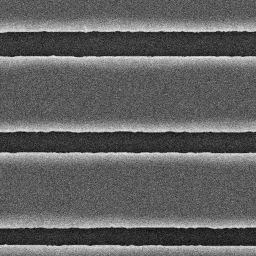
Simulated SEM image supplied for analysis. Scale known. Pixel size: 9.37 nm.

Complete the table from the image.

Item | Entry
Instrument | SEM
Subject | lines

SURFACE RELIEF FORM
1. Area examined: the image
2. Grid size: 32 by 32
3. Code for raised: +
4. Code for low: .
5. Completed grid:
++++++++++++++++++++++++++++++++
++++++++++++++++++++++++++++++++
++++++++++++++++++++++++++++++++
++++++++++++++++++++++++++++++++
................................
................................
................................
++++++++++++++++++++++++++++++++
++++++++++++++++++++++++++++++++
++++++++++++++++++++++++++++++++
++++++++++++++++++++++++++++++++
++++++++++++++++++++++++++++++++
++++++++++++++++++++++++++++++++
++++++++++++++++++++++++++++++++
++++++++++++++++++++++++++++++++
++++++++++++++++++++++++++++++++
................................
................................
................................
++++++++++++++++++++++++++++++++
++++++++++++++++++++++++++++++++
++++++++++++++++++++++++++++++++
++++++++++++++++++++++++++++++++
++++++++++++++++++++++++++++++++
++++++++++++++++++++++++++++++++
++++++++++++++++++++++++++++++++
++++++++++++++++++++++++++++++++
++++++++++++++++++++++++++++++++
................................
................................
................................
++++++++++++++++++++++++++++++++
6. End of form